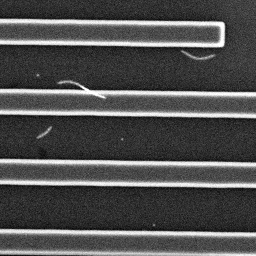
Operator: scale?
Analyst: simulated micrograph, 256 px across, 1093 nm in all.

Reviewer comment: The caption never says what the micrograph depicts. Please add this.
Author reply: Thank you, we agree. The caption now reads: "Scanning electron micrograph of groups of lines, slits or small figures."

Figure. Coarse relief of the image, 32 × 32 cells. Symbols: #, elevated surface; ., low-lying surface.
................................
................................
................................
############################....
############################....
................############....
................................
................................
................................
................................
................................
############....................
################################
################################
.............................###
................................
................................
................................
................................
................................
################################
################################
################################
................................
................................
................................
................................
................................
................................
################################
################################
################################